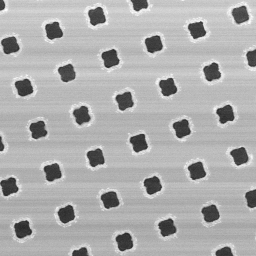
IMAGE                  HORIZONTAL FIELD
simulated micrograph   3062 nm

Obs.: a regular array of holes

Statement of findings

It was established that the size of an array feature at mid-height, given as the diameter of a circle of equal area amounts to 212 nm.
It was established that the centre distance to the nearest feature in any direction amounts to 44.5 pixels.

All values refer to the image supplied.